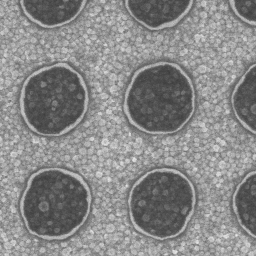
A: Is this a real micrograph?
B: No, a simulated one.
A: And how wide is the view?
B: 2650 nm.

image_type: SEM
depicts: raised bodies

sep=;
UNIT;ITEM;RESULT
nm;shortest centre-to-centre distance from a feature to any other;1080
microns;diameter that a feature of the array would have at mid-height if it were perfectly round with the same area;0.713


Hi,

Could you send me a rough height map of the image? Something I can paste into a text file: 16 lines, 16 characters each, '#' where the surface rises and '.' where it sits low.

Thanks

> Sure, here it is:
.####...####...#
..##.....##.....
................
................
..###....##....#
.####...####...#
.####...####...#
..###...####...#
................
................
................
..###....###...#
.#####..####...#
.####...####...#
..###....##....#
................